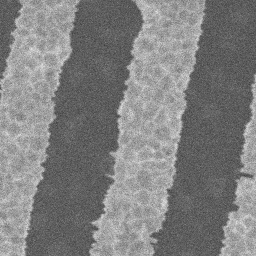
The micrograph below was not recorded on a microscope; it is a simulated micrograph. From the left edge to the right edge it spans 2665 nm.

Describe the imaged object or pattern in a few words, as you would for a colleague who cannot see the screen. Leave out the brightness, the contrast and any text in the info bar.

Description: one or a few lines or trenches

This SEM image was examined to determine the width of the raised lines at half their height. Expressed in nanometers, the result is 535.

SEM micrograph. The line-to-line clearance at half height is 703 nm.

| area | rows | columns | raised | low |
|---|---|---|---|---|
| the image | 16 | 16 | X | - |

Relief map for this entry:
-XXXX----XXXX---
-XXXX----XXXX---
-XXX-----XXX----
-XXX----XXXX----
XXXX----XXXX----
XXXX----XXXX----
XXX-----XXXX----
XXX----XXXX-----
XXX----XXXX----X
XXX----XXXX----X
XXX----XXXX----X
XX-----XXXX----X
XX-----XXX-----X
XX----XXXX----XX
XX----XXXX----XX
XX----XXXX----XX